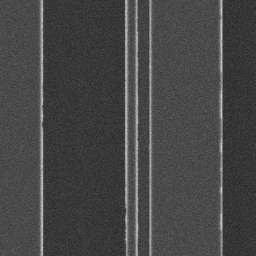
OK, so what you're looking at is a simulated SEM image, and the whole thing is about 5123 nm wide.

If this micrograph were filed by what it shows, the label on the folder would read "lines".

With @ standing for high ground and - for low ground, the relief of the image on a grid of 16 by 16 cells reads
@@@-----@@@@@@--
@@@-----@@@@@@--
@@@-----@@@@@@--
@@@-----@@@@@@--
@@@-----@@@@@@--
@@@-----@@@@@@--
@@@-----@@@@@@--
@@@-----@@@@@@--
@@@-----@@@@@@--
@@@-----@@@@@@--
@@@-----@@@@@@--
@@@-----@@@@@@--
@@@-----@@@@@@--
@@@-----@@@@@@--
@@@-----@@@@@@--
@@@-----@@@@@@--